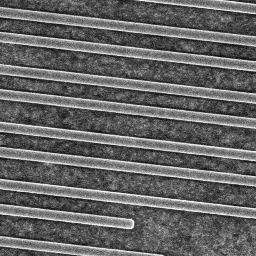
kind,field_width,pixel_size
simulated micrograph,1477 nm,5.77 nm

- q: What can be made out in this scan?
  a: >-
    parallel lines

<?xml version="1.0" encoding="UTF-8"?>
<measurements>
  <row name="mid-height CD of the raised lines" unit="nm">55.8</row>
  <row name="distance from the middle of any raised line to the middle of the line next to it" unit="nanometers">164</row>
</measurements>